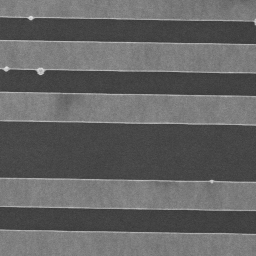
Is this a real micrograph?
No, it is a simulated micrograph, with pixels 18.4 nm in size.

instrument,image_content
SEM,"groups of lines, slits or small figures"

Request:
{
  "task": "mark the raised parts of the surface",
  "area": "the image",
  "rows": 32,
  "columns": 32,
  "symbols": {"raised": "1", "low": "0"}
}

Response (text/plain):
11111111111111111111111111111111
11111111111111111111111111111111
00000000000000000000000011111111
00000000000000000000000000000000
00000000000000000000000000000000
11111111111111111111111111111000
11111111111111111111111111111111
11111111111111111111111111111111
11111111111111111111111111111111
00000000000000000000000000000000
00000000000000000000000000000000
00000000000000000000000000000000
11111111111111111111111111111111
11111111111111111111111111111111
11111111111111111111111111111111
00000000000000000000000000000111
00000000000000000000000000000000
00000000000000000000000000000000
00000000000000000000000000000000
00000000000000000000000000000000
00000000000000000000000000000000
00000000000000000000000000000000
11111111111111000000000000000000
11111111111111111111111111111111
11111111111111111111111111111111
11111111111111111111111111111111
00000000000000000000000000000000
00000000000000000000000000000000
00000000000000000000000000000000
11111111111111111111111111111111
11111111111111111111111111111111
11111111111111111111111111111111